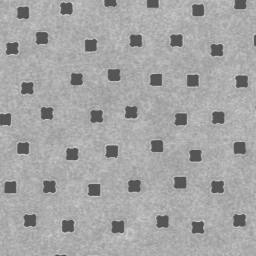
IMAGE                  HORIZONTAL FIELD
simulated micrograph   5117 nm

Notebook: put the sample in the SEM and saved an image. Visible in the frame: a regular array of holes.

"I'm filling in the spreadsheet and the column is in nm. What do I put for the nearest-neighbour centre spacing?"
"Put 740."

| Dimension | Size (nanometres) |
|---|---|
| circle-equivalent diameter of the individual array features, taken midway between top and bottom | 270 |